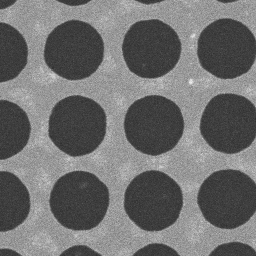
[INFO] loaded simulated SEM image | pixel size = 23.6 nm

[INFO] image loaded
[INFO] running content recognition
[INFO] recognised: holes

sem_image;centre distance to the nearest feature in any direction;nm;1770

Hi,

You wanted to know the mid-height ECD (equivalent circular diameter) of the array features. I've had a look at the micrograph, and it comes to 1420 nm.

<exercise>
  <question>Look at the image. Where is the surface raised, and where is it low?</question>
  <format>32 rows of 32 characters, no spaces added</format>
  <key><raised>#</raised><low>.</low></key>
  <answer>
..######...#######.#############
################################
#########.########..#######...##
..#####.....####......####.....#
...###.......###......###.......
...###.......##........##.......
...##........##........##.......
...###.......###......###.......
...###......####......###......#
..#####....######...#######...##
################################
################################
########....#####....#####.....#
...####......###......####......
...###.......###.......##.......
....##.......##........##.......
....##.......###.......##.......
....##.......###......####......
...####.....#####.....#####....#
..#######.######################
################################
.########..#######..#######...##
...####......###......####......
...####.......##.......##.......
....##........##.......##.......
....##........#........##.......
....##.......###.......##.......
...####......###......####.....#
..######....#####....######...##
################################
###################.########...#
..######....#####.....####......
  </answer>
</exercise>